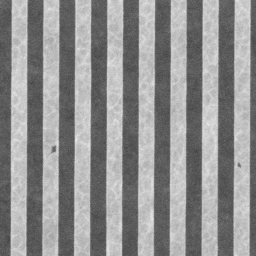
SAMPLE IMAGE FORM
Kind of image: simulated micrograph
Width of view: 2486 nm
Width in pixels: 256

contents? parallel lines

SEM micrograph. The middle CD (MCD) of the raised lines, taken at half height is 0.146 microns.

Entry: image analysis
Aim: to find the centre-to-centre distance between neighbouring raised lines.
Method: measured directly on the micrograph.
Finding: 309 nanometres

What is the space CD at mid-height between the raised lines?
16.9 pixels